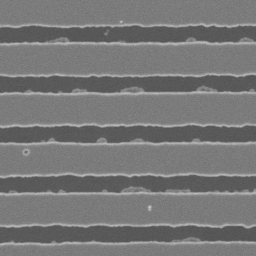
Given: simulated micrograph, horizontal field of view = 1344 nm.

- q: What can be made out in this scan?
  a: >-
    lines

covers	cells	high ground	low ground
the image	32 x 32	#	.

################################
################################
################################
................................
................................
################################
################################
################################
################################
.#####...##.#.#####....##....#..
................................
........................###.#.#.
################################
################################
################################
################################
................................
................................
################################
################################
################################
################################
................................
................................
################################
################################
################################
################################
................................
................................
################################
################################